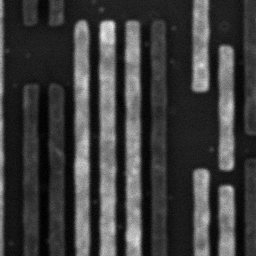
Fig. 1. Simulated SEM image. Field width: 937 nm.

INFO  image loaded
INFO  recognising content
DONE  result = wiring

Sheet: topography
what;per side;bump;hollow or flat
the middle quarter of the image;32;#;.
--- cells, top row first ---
...###...####...###...###.......
...###...####...###...###.......
...###...####...###...###.......
...###...####...###...###.......
...###...####...###...###.......
...###...####...###...###.......
...###...####..####...###.......
...###...####..####...###.......
...###...####..####...###.......
...###...####...###...###.......
...###...####...###...###.......
...###...####...###...###.......
...###...####...###...###.......
...###...####...###...###.......
...###...####...###...###.......
...###...####...###...###.......
...###...####...###...###.......
...###...####...###...###.......
...###...####...###...###.......
...###...####...###...###.......
...###...####...###...###.......
...###...####...###...###.......
...###...####...###...###.......
...###...####...###...###.......
...###...####...###...###.......
...###...####...###...###.......
...###...####...###...###.......
...###...####...###...###.......
...###...####...###...###.......
...###...####...###...###.......
...###...####...###...###.......
...###...####...###...###.......